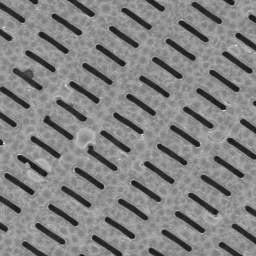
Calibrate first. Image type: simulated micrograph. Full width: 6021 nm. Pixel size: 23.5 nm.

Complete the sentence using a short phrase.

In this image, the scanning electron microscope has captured a regular array of holes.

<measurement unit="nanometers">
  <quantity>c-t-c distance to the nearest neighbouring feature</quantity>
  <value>529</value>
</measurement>